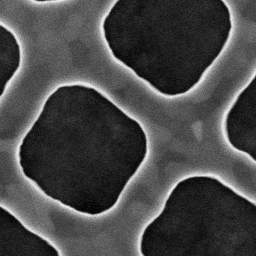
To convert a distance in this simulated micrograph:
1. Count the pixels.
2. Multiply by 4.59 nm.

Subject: holes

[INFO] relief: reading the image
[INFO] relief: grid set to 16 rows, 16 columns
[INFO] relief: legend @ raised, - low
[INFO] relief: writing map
@@@@@@@-------@@
@@@@@@@-------@@
-@@@@@@-------@@
-@@@@@@-------@@
-@@@@@@@-----@@@
@@@@--@@@@--@@@-
@@@----@@@@@@@@-
@@------@@@@@@--
@@-------@@@@@--
@--------@@@@@@-
@--------@@@@@@@
@@------@@@---@@
@@@@---@@@-----@
-@@@@@@@@@------
--@@@@@@@-------
---@@@@@@-------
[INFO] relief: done